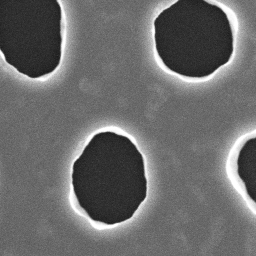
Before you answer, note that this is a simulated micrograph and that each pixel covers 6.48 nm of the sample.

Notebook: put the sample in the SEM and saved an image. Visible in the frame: holes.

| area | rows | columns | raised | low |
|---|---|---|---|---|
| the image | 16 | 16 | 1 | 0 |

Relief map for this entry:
0000111111000011
0000111111000011
0000111111000001
0000111111000011
1001111111100111
1111111111111111
1111111111111111
1111111111111111
1111110011111110
1111100001111110
1111100001111110
1111100001111110
1111100001111111
1111100011111111
1111111111111111
1111111111111111